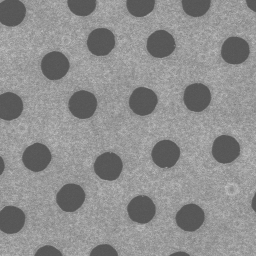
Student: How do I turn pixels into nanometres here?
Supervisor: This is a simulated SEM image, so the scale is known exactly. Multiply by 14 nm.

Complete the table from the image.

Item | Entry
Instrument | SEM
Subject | a regular array of holes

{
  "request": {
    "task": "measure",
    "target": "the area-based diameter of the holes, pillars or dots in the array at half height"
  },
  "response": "399 nm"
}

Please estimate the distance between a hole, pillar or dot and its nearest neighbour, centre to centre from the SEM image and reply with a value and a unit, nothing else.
730 nm